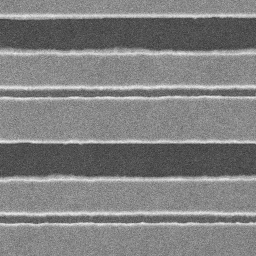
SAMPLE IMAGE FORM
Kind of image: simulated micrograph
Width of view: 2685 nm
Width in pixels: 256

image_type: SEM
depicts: lines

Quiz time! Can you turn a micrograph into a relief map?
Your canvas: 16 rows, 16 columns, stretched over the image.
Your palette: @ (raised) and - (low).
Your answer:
@@@@@@@@@@@@@@@@
----------------
----------------
@@@@@@@@@@@@@@@@
@@@@@@@@@@@@@@@@
@@@@@@@@@@@@@@@@
@@@@@@@@@@@@@@@@
@@@@@@@@@@@@@@@@
@@@@@@@@@@@@@@@@
----------------
----------------
@@@@@@@@@@@@@@@@
@@@@@@@@@@@@@@@@
@@@@@@@@@@@@@@@@
@@@@@@@@@@@@@@@@
@@@@@@@@@@@@@@@@